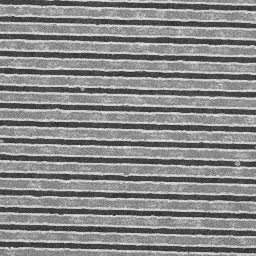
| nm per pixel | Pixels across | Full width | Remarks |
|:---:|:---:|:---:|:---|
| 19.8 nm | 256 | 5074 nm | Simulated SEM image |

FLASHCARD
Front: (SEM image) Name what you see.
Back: parallel lines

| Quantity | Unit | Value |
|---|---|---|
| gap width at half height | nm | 149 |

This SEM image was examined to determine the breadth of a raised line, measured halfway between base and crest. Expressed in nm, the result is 203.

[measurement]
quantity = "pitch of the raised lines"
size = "343 nanometres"